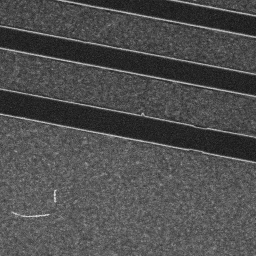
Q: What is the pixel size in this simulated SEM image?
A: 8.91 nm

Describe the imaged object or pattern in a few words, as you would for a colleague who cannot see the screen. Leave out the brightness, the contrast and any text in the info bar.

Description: one or a few lines or trenches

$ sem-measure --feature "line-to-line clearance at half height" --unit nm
351